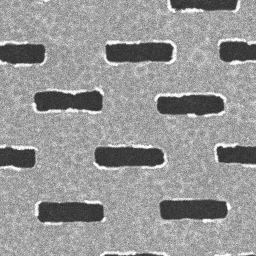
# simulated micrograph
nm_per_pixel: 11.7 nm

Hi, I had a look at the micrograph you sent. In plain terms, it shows holes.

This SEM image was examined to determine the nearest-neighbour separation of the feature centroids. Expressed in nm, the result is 945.